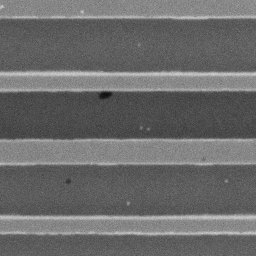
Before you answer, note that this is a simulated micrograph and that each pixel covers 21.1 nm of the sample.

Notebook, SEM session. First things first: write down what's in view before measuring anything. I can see lines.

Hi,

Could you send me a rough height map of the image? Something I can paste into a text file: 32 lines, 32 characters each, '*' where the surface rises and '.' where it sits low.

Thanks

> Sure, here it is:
********************************
********************************
................................
................................
................................
................................
................................
................................
................................
********************************
********************************
................................
................................
................................
................................
................................
................................
...**......***..*****..*.*******
********************************
********************************
................................
................................
................................
................................
................................
................................
................................
********************************
********************************
................................
................................
................................